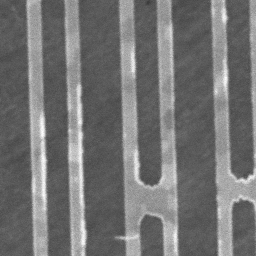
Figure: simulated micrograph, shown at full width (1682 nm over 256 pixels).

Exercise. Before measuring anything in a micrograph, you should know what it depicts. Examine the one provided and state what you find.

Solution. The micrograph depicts parallel lines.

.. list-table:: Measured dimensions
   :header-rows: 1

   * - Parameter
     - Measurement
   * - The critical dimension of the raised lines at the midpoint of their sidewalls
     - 87.9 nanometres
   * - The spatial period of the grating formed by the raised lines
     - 0.303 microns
